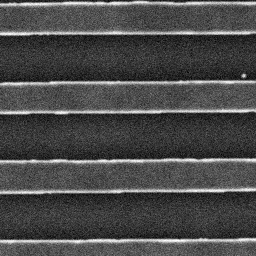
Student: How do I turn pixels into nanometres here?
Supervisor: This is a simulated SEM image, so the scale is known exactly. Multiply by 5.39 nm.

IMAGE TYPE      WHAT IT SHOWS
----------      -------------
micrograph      lines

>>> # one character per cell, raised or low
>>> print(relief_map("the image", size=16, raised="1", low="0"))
1111111111111111
1111111111111111
0000000000000000
0000000000000000
0000000000000000
1111111111111111
1111111111111111
0000000000000000
0000000000000000
0000000000000000
1111111111111111
1111111111111111
0000000000000000
0000000000000000
0000000000000000
1111111111111111